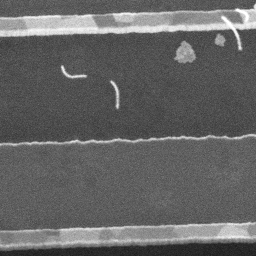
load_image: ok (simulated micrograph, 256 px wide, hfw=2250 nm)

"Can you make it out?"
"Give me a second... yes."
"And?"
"lines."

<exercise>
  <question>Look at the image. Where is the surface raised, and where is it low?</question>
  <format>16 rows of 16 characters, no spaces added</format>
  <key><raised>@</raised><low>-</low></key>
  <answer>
@@@@@@@@@@@@@@@@
@@@@@@@@@@@@@@@@
----------------
----------------
----------------
----------------
----------------
----------------
---------------@
@@@@@@@@@@@@@@@@
@@@@@@@@@@@@@@@@
@@@@@@@@@@@@@@@@
@@@@@@@@@@@@@@@@
@@@@@@@@@@@@@@@@
@@@@@@@@@@@@@@@@
----------------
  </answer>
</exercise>